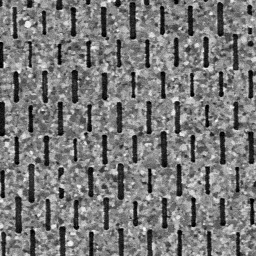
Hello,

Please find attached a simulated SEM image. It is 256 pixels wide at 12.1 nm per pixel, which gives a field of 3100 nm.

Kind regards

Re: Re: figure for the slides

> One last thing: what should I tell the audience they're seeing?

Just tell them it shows a regular array of holes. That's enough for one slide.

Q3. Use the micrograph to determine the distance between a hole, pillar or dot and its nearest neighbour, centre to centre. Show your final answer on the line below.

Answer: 29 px